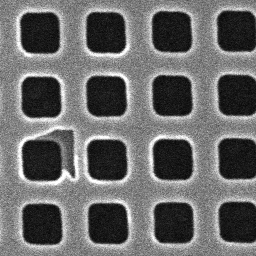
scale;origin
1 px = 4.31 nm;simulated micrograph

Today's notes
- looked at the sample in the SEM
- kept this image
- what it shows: a regular array of holes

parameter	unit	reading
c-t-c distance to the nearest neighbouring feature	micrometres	0.274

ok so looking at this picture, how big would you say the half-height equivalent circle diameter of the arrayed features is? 193 nm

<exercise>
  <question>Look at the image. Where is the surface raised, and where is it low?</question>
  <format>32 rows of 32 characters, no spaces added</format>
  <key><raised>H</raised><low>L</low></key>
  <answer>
HHHHHHHHHHHHHHHHHHHHHHHHHHHHHHHH
HHHHHHHHHHHHLLHHHHHHLLLHHHHHLLLH
HHHLLLLHHHHLLLLLHHHLLLLLHHHLLLLL
HHLLLLLLHHHLLLLLHHHLLLLLHHHLLLLL
HHHLLLLLHHHLLLLLHHHLLLLLHHHLLLLL
HHHLLLLLHHHLLLLLHHHLLLLLHHHLLLLL
HHHLLLLHHHHLLLLHHHHHLLLHHHHHHLLH
HHHHHHHHHHHHHHHHHHHHHHHHHHHHHHHH
HHHHHHHHHHHHHHHHHHHHHHHHHHHHHHHH
HHHHHLHHHHHHLLHHHHHHLLLHHHHHLLLH
HHHLLLLLHHHLLLLLHHHLLLLLHHHLLLLL
HHHLLLLLHHHLLLLLHHHLLLLLHHHLLLLL
HHHLLLLLHHHLLLLLHHHLLLLLHHHLLLLL
HHHLLLLLHHHLLLLLHHHLLLLLHHHLLLLL
HHHLLLLHHHHHLLLHHHHHLLLHHHHHHLLH
HHHHHHHHHHHHHHHHHHHHHHHHHHHHHHHH
HHHHHHHHHHHHHHHHHHHHHHHHHHHHHHHH
HHHLLLHHHHHHLLLHHHHHLLLHHHHHLLLL
HHHLLLLLHHHLLLLLHHHLLLLLHHHLLLLL
HHHLLLLLHHHLLLLLHHHLLLLLHHHLLLLL
HHHLLLLLHHHLLLLLHHHLLLLLHHHLLLLL
HHHLLLLLHHHLLLLLHHHLLLLLHHHLLLLL
HHHHLLLHHHHHLLLHHHHHLLLHHHHHHLLH
HHHHHHHHHHHHHHHHHHHHHHHHHHHHHHHH
HHHHHHHHHHHHHHHHHHHHHHHHHHHHHHHH
HHHLLLHHHHHHLLLHHHHHLLLLHHHHLLLL
HHHLLLLLHHHLLLLLHHHLLLLLHHHLLLLL
HHHLLLLLHHHLLLLLHHHLLLLLHHHLLLLL
HHHLLLLLHHHLLLLLHHHLLLLLHHHLLLLL
HHHLLLLLHHHLLLLLHHHLLLLLHHHHLLLL
HHHHLLLHHHHHLLLHHHHHHHHHHHHHHHHH
HHHHHHHHHHHHHHHHHHHHHHHHHHHHHHHH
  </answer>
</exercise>